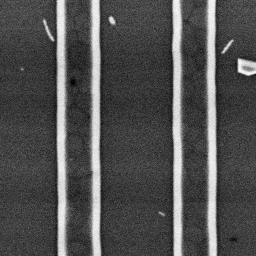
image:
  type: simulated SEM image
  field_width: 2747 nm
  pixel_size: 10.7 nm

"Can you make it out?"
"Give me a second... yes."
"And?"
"wiring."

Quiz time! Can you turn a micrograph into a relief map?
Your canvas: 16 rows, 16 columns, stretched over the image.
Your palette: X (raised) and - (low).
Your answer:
----XX-----XX---
----XX-----XX---
----XX-----XX---
----XX-----XX---
----XX-----XX---
----XX-----XX---
----XX-----XX---
----XX-----XX---
----XX-----XX---
----XX-----XX---
----XX-----XX---
----XX-----XX---
----XX-----XX---
----XX-----XX---
----XX-----XX---
----XX-----XX---